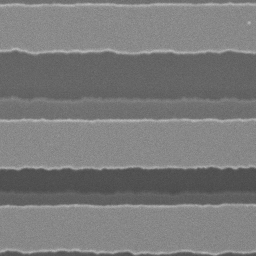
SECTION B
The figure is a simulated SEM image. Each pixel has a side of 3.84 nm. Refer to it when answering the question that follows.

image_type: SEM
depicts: lines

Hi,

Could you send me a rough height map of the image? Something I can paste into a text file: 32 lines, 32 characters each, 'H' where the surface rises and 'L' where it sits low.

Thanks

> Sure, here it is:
LHHLLHHHLHHHHHHLLLHHHHHHHHHHHHHH
HHHHHHHHHHHHHHHHHHHHHHHHHHHHHHHH
HHHHHHHHHHHHHHHHHHHHHHHHHHHHHHHH
HHHHHHHHHHHHHHHHHHHHHHHHHHHHHHHH
HHHHHHHHHHHHHHHHHHHHHHHHHHHHHHHH
HHHHHHHHHHHHHHHHHHHHHHHHHHHHHHHH
LLLHHHHHHLHLLLHHHHHHHHHHHHLHLLHH
LLLLLLLLLLLLLLLLLLLLLLLLLLLLLLLL
LLLLLLLLLLLLLLLLLLLLLLLLLLLLLLLL
LLLLLLLLLLLLLLLLLLLLLLLLLLLLLLLL
LLLLLLLLLLLLLLLLLLLLLLLLLLLLLLLL
LLLLLLLLLLLLLLLLLLLLLLLLLLLLLLLL
LLLLLLLLLLLLLLLLLLLLLLLLLLLLLLLL
LLLLLLLLLLLLLLLLLLLLLLLLLLLLLLLL
LLLLLLLLLLLLLLLLLLLLLLLLLLLLLLLL
HHHHHHHHHHHHHHHHHHHHHHHHHHHHHHHH
HHHHHHHHHHHHHHHHHHHHHHHHHHHHHHHH
HHHHHHHHHHHHHHHHHHHHHHHHHHHHHHHH
HHHHHHHHHHHHHHHHHHHHHHHHHHHHHHHH
HHHHHHHHHHHHHHHHHHHHHHHHHHHHHHHH
HHHHHHHHHHHHHHHHHHHHHHHHHHHHHHHH
LLLLLLLLLLLLLLLLLLLLLLLLLLLLLLLL
LLLLLLLLLLLLLLLLLLLLLLLLLLLLLLLL
LLLLLLLLLLLLLLLLLLLLLLLLLLLLLLLL
LLLLLLLLLLLLLLLLLLLLLLLLLLLLLLLL
LLLLLLLLLLLLLLLLLLLLLLLLLLLLHHHH
HHHHHHHHHHHHHHHHHHHHHHHHHHHHHHHH
HHHHHHHHHHHHHHHHHHHHHHHHHHHHHHHH
HHHHHHHHHHHHHHHHHHHHHHHHHHHHHHHH
HHHHHHHHHHHHHHHHHHHHHHHHHHHHHHHH
HHHHHHHHHHHHHHHHHHHHHHHHHHHHHHHH
LLHHHLLLLLLHHHHLHHHHHHHLHHHHHHHH